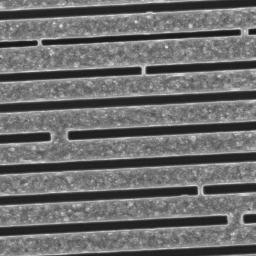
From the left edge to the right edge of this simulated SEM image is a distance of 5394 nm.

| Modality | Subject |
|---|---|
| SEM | parallel lines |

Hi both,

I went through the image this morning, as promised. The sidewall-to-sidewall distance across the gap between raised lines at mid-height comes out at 160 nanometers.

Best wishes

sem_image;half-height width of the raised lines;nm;481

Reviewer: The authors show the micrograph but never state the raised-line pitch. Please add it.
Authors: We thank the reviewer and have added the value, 30.8 pixels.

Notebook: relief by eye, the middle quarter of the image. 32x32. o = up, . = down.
oooooooooooooooooooooo..........
ooo................o............
...................ooooooooooooo
.ooooooooooooooooooooooooooooooo
oooooooooooooooooooooooooooooooo
oooooooooooooooooooooooooooooooo
oooooooooooooooooooooooooooooooo
oooooooooooooooooooooooooooooo..
ooooooooooo.....................
................................
..................oooooooooooooo
oooooooooooooooooooooooooooooooo
oooooooooooooooooooooooooooooooo
oooooooooooooooooooooooooooooooo
oooooooooooooooooooooooooooooooo
oooooooooooooooooooooooooooo....
oooooooo........................
o.............................oo
o..........ooooooooooooooooooooo
oooooooooooooooooooooooooooooooo
oooooooooooooooooooooooooooooooo
oooooooooooooooooooooooooooooooo
oooooooooooooooooooooooooooooooo
ooooooooooooooooooooo...........
oo..............................
.........................o.ooooo
....oooooooooooooooooooooooooooo
oooooooooooooooooooooooooooooooo
oooooooooooooooooooooooooooooooo
oooooooooooooooooooooooooooooooo
oooooooooooooooooooooooooooooooo
oooooooooooooo..................